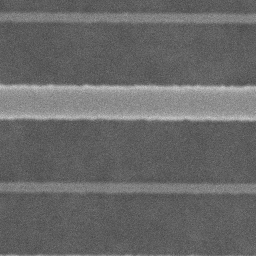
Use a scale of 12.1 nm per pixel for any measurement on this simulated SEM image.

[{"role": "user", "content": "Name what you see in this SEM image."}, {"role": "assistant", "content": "lines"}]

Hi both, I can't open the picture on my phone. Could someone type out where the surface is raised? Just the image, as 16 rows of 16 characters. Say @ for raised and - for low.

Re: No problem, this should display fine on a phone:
----------------
----------------
----------------
----------------
----------------
@@@@@@@@@@@@@@@@
@@@@@@@@@@@@@@@@
---------------@
----------------
----------------
----------------
----------------
----------------
----------------
----------------
----------------